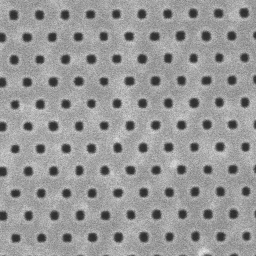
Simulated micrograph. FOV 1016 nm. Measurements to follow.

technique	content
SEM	a regular array of holes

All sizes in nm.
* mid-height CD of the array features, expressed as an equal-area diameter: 36.4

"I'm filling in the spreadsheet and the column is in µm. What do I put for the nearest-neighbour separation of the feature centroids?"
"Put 0.101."